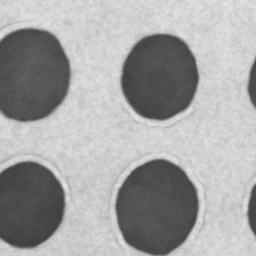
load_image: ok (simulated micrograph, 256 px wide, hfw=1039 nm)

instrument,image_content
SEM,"holes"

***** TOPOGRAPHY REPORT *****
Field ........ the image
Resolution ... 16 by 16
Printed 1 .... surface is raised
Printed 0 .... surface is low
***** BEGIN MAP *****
1111111111111111
1111111111111111
0000111110011111
0000111100001111
0000111100001111
0000111100001111
0000111100001111
1011111111111111
1111111111111111
1111111111111111
0001111110011111
0000111100001111
0000111000001111
0000111000001111
0001111100001111
1111111100011111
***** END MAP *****